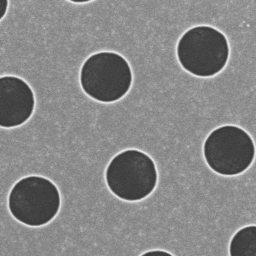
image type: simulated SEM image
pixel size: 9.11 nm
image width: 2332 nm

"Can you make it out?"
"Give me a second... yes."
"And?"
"holes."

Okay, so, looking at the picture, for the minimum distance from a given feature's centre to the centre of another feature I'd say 916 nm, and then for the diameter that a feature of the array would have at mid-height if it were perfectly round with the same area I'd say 456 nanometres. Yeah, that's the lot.